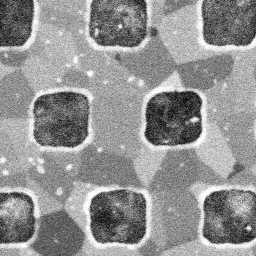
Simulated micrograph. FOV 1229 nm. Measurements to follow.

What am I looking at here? holes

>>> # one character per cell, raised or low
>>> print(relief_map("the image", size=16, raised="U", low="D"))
DDUUUUDDDUUUUDDD
DDUUUUDDDUUUUDDD
DDUUUUDDDUUUUDDD
UUUUUUUUUUUUUUUU
UUUUUUUUUUUUUUUU
UUUUUUUUUUUUUUUU
UUDDDDUUUDDDDUUU
UUDDDDUUUDDDDUUU
UUDDDDUUUDDDUUUU
UUUUUUUUUUUUUUUU
UUUUUUUUUUUUUUUU
UUUUUUUUUUUUUUUU
DDUUUUDDDUUUUDDD
DDUUUUDDDUUUUDDD
DDUUUUDDDUUUUDDD
UUUUUUUUUUUUUUUU